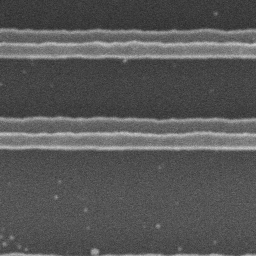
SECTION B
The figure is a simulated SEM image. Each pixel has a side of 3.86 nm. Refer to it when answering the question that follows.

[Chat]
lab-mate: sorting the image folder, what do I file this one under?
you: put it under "lines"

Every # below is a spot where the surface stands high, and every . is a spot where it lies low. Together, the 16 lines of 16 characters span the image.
................
................
################
################
................
................
................
##############.#
################
................
................
................
................
................
................
................